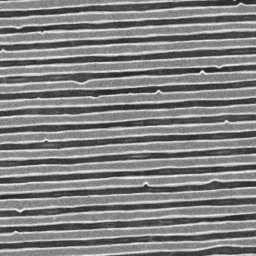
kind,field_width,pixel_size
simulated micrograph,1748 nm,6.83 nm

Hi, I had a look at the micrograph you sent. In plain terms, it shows parallel lines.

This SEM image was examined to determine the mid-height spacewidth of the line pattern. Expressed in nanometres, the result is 46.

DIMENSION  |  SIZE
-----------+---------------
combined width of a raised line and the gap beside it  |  16.6 pixels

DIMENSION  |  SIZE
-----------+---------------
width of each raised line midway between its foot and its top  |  63.9 nm